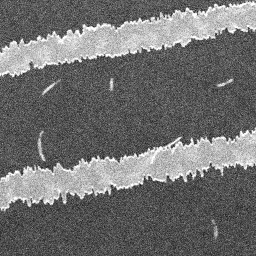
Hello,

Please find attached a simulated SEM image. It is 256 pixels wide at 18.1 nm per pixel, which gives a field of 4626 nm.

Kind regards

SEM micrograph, one or a few lines or trenches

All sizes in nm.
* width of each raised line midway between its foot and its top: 500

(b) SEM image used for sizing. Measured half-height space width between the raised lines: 1840 nanometers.